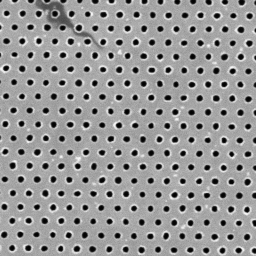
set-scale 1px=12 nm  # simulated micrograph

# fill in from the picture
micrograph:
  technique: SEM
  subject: a regular array of holes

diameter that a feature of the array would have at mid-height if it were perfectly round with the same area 71.7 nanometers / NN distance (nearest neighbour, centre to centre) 188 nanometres